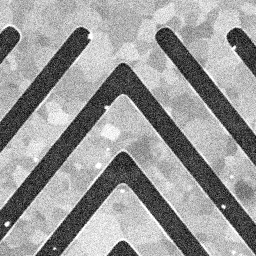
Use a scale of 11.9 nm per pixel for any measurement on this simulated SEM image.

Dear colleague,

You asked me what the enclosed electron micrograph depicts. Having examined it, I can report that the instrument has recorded groups of lines, slits or small figures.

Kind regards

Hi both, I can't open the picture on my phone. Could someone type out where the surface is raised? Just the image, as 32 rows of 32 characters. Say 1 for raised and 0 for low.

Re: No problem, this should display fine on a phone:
11111111111111111111111111111111
11111111111111111111111111111111
11111111111111111111111111111111
10111111110111111111011111111011
00011111100111111110001111110001
00111111000111111111000111111000
01111110001111111111000011111000
01111100001111111111100001111100
11111000011111001111110001111110
11111000111111000111111000111111
11110001111110000011111100011111
11100011111100000001111100001111
11000011111000110000111110000111
10000111110000111000111111000111
10001111100001111100011111100011
00011111100011111110001111110001
00111111000111111111000111110000
01111110001111111111000011111000
01111100001111111111100011111100
11111000011111001111110001111110
11111000111111000111111000111111
11110001111110000011111100011111
11100011111100000001111100001111
11000011111000110000111110001111
10000111110000111000111111000111
10001111110001111100011111100011
00011111100011111110001111100001
00111111000111111110000111110000
01111110001111111111000111111000
01111100001111111111100011111100
11111000011111001111110001111110
11111000111111000111111000111111